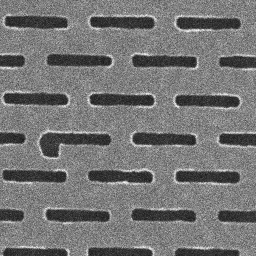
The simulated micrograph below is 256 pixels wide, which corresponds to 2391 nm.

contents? a regular array of holes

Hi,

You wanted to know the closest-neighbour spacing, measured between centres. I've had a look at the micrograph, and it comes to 0.537 um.